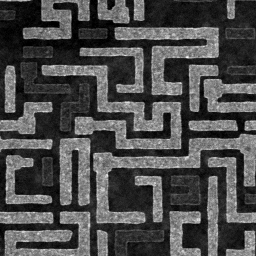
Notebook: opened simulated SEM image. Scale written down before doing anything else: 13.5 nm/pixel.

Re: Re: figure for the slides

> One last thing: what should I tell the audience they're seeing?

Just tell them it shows wiring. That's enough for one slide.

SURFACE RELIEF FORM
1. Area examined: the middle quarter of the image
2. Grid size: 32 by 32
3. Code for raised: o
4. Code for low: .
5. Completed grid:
..................oo..ooo.......
ooooooooooo.......oo..ooo......o
ooooooooooo.......oo..ooo......o
........ooo.......oo..ooo......o
........ooo.......oo..ooo.......
o...oo..ooo..ooooooo..ooooooo...
o...oo..ooo..ooooooo..ooooooo...
....oo..ooo...........ooooooo...
....oo..ooo.....................
...ooo..ooo.....................
oooooo...ooooooooooo..ooooooo...
oooooo...ooooooooooo..ooooooo...
oo................oo..ooo..oo...
oo.oooo...........oo..ooo..oo...
oo.oooooooooooo...ooooooo..oo..o
oo.oooooooooooo...ooooooo..oo..o
o..ooooo....ooo...o..oo....oo...
.............oo............oo...
.............ooo...........oo...
oooooo.......oooooooooooooooo..o
oooooo.......oooooooooooooooo..o
oo.ooo.........................o
oo..oo..oooo...................o
oo..oo.ooooooooooooooooooooooooo
oo..oo.ooooooooooooooooooooooooo
oo..oo.ooooooooooooooooooooooooo
oo..oo.ooooo....................
oo..oo..ooo.....................
oo..oo..ooo.......oooooo...ooooo
oo..oo..ooo.......oooooo...ooooo
oo..oo..ooo...........oo.......o
oo..oo..ooo...........oo.......o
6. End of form